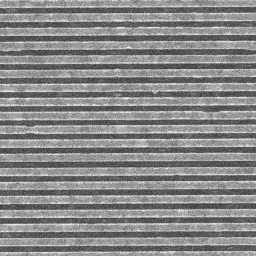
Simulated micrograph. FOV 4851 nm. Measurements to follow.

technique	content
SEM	parallel lines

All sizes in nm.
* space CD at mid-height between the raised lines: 130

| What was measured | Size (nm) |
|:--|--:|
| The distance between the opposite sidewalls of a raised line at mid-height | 133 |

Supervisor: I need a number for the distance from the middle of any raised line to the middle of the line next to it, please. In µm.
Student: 0.266